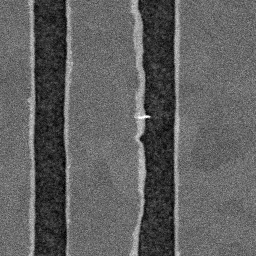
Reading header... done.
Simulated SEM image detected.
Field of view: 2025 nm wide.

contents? one or a few lines or trenches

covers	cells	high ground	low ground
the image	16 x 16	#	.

##..####...#####
##..#####..#####
##..#####..#####
##..#####..#####
##..#####..#####
##..#####..#####
##..#####..#####
##..#####..#####
##..#####..#####
##..#####..#####
##..#####..#####
##..#####..#####
##..#####..#####
##..#####..#####
##..#####..#####
##..####...#####